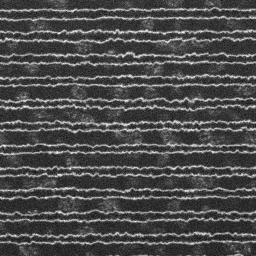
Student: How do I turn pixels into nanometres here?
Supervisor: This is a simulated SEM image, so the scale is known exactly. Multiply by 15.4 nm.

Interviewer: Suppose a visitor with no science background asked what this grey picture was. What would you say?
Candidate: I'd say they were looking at parallel lines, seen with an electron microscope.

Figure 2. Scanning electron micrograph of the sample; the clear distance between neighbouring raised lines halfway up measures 106 nm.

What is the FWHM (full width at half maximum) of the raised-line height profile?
243 nanometers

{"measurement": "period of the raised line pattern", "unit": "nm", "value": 347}